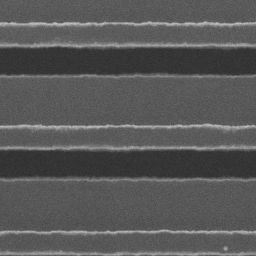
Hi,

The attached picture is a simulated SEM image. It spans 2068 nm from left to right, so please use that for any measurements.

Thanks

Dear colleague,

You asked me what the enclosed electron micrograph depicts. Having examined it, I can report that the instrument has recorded lines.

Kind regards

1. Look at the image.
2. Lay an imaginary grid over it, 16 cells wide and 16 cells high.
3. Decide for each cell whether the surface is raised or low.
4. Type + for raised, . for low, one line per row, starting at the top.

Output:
++++++++++++++++
++++++++++++++++
++++++++++++++++
................
................
++++++++++++++++
++++++++++++++++
++++++++++++++++
++++++++++++++++
................
................
++++++++++++++++
++++++++++++++++
++++++++++++++++
++++++++++++++++
++++++++++++++++